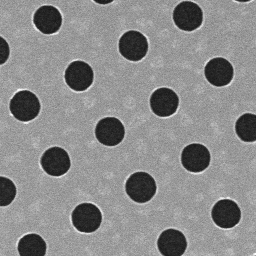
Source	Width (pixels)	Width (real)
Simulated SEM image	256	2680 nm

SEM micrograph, a regular array of holes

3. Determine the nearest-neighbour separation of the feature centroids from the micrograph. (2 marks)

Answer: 650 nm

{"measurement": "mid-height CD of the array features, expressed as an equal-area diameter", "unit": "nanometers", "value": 313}